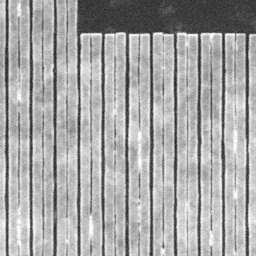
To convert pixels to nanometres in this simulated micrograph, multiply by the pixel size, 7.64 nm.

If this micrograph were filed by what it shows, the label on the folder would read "parallel lines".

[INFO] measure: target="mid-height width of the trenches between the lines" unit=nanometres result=30.5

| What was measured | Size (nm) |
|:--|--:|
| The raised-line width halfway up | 67.8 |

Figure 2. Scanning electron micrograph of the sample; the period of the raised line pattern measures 0.091 micrometres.